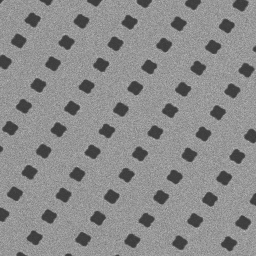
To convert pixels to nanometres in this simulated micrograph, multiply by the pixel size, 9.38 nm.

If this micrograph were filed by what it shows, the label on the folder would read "a regular array of holes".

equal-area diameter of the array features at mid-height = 128 nm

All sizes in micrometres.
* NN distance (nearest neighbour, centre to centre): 0.239